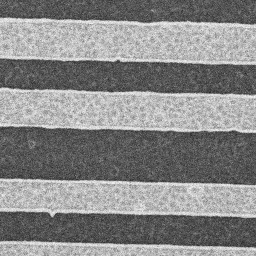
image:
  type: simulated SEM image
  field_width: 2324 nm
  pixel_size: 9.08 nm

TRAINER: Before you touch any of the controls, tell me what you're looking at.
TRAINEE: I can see one or a few lines or trenches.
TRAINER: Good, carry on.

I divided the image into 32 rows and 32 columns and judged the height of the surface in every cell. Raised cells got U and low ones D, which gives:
DDDDDDDDDDDDDDDDDDDDDDDDDDDDDDDD
DDDDDDDDDDDDDDDDDDDDDDDDDDDDDDDD
UDDDDDDDDDDDDDDDDDDDDDDDDDDDDDDD
UUUUUUUUUUUUUUUUUUUUUUUUUUUUUUUU
UUUUUUUUUUUUUUUUUUUUUUUUUUUUUUUU
UUUUUUUUUUUUUUUUUUUUUUUUUUUUUUUU
UUUUUUUUUUUUUUUUUUUUUUUUUUUUUUUU
DDDDDDDDDDDDDDDDDDUUUUUUUUUUUUUU
DDDDDDDDDDDDDDDDDDDDDDDDDDDDDDDD
DDDDDDDDDDDDDDDDDDDDDDDDDDDDDDDD
DDDDDDDDDDDDDDDDDDDDDDDDDDDDDDDD
UUUUUUUUUDDDDDDDDDDDDDDDDDDDDDDD
UUUUUUUUUUUUUUUUUUUUUUUUUUUUUUUU
UUUUUUUUUUUUUUUUUUUUUUUUUUUUUUUU
UUUUUUUUUUUUUUUUUUUUUUUUUUUUUUUU
UUUUUUUUUUUUUUUUUUUUUUUUUUUUUUUU
DDDDDDDDDDDDDDDDDDDDDDDDDDDDDDDD
DDDDDDDDDDDDDDDDDDDDDDDDDDDDDDDD
DDDDDDDDDDDDDDDDDDDDDDDDDDDDDDDD
DDDDDDDDDDDDDDDDDDDDDDDDDDDDDDDD
DDDDDDDDDDDDDDDDDDDDDDDDDDDDDDDD
DDDDDDDDDDDDDDDDDDDDDDDDDDDDDDDD
DDDDDDDDDDDDDDDDDDDDDDDDDDDDDDDD
UUUUUUUUUUUUUUUUUUUUUUUUUUUUUUUU
UUUUUUUUUUUUUUUUUUUUUUUUUUUUUUUU
UUUUUUUUUUUUUUUUUUUUUUUUUUUUUUUU
DDDDDDUDDDDUUDDUUUUUUUUUUUUUUUUU
DDDDDDDDDDDDDDDDDDDDDDDDDDDDDDDD
DDDDDDDDDDDDDDDDDDDDDDDDDDDDDDDD
DDDDDDDDDDDDDDDDDDDDDDDDDDDDDDDD
UUUUUUDDDDDDDDDDDDDDDDDDDDDDDDDD
UUUUUUUUUUUUUUUUUUUUUUUUUUUUUUUU